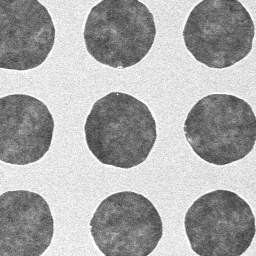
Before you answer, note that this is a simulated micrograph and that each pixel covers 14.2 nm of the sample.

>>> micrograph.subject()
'holes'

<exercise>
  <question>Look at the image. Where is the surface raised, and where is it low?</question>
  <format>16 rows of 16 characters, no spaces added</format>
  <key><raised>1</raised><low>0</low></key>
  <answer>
0001110001110001
0001100000110000
0001100000100000
0001110001110001
1111111111111111
1111111111111111
0001110001110001
0001100000110000
0001100000110000
0001110001110000
1111111111111111
1111111111111111
0001110001110001
0001110000110000
0001110000110000
0001110000110001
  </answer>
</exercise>